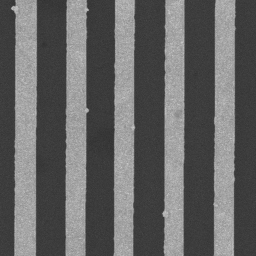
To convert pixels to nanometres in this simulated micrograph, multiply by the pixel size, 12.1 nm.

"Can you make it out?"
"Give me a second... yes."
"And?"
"lines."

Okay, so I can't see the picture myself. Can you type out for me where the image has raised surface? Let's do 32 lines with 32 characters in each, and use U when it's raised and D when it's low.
DDUUUDDDUUUDDDUUUDDDDUUDDDDUUDDD
DDUUUDDDUUUDDDUUUDDDDUUDDDDUUDDD
DDUUUDDDUUUDDDUUUDDDDUUDDDDUUDDD
DDUUUDDDUUUDDDUUUDDDDUUDDDDUUDDD
DDUUUDDDUUUDDDUUUDDDDUUDDDDUUDDD
DDUUUDDDUUUDDDUUUDDDDUUDDDDUUDDD
DDUUUDDDUUUDDDUUUDDDDUUDDDDUUDDD
DDUUUDDDUUUDDDUUUDDDDUUDDDDUUDDD
DDUUUDDDUUUDDDUUUDDDDUUDDDDUUDDD
DDUUUDDDUUUDDDUUUDDDDUUDDDDUUDDD
DDUUUDDDUUUDDDUUUDDDDUUDDDDUUDDD
DDUUUDDDUUUDDDUUUDDDDUUDDDDUUDDD
DDUUUDDDUUUDDDUUUDDDDUUDDDDUUDDD
DDUUUDDDUUUDDDUUUDDDDUUDDDDUUDDD
DDUUUDDDUUUDDDUUUDDDDUUDDDDUUDDD
DDUUUDDDUUUDDDUUUDDDDUUDDDDUUDDD
DDUUDDDDUUUDDDUUUDDDDUUDDDDUUDDD
DDUUDDDDUUUDDDUUUDDDDUUDDDDUUDDD
DDUUDDDDUUUDDDUUUDDDDUUDDDDUUDDD
DDUUDDDDUUUDDDUUUDDDDUUDDDDUUDDD
DDUUDDDDUUUDDDUUUDDDDUUDDDDUUDDD
DDUUDDDDUUUDDDUUUDDDDUUDDDDUUDDD
DDUUDDDDUUUDDDUUUDDDDUUDDDDUUDDD
DDUUDDDDUUUDDDUUUDDDDUUDDDDUUDDD
DDUUDDDDUUUDDDUUUDDDDUUDDDDUUDDD
DDUUDDDDUUUDDDUUUDDDDUUDDDDUUDDD
DDUUDDDDUUUDDDUUUDDDUUUDDDDUUDDD
DDUUDDDDUUUDDDUUUDDDDUUDDDDUUDDD
DDUUDDDDUUUDDDUUUDDDDUUDDDDUUDDD
DDUUDDDDUUUDDDUUUDDDDUUDDDDUUDDD
DDUUDDDDUUUDDDUUUDDDDUUDDDDUUDDD
DDUUDDDDUUUDDDUUUDDDDUUDDDDUUDDD